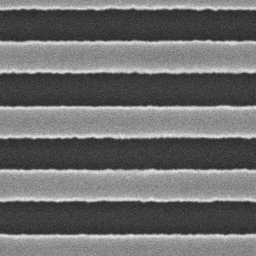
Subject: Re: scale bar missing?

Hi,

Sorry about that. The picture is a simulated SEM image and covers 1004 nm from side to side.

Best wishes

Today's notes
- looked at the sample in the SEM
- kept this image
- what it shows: lines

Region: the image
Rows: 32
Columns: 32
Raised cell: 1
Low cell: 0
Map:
11111111111111111111111111111111
00000000000000000000000000000000
00000000000000000000000000000000
00000000000000000000000000000000
00000000000000000000000000000000
11111111111111111111111111111111
11111111111111111111111111111111
11111111111111111111111111111111
11111111111111111111111111111111
00000000000000000000000000000000
00000000000000000000000000000000
00000000000000000000000000000000
00000000000000000000000000000000
11111111111111111111111111111111
11111111111111111111111111111111
11111111111111111111111111111111
11111111111111111111111111111111
00000000000000000000000000000000
00000000000000000000000000000000
00000000000000000000000000000000
00000000000000000000000000000000
11111111111111111111111111111111
11111111111111111111111111111111
11111111111111111111111111111111
11111111111111111111111111111111
00000000000000000000000000000000
00000000000000000000000000000000
00000000000000000000000000000000
00000000000000000000000000000000
11111111111111111111111111111111
11111111111111111111111111111111
11111111111111111111111111111111